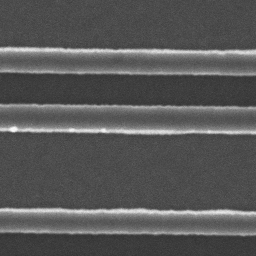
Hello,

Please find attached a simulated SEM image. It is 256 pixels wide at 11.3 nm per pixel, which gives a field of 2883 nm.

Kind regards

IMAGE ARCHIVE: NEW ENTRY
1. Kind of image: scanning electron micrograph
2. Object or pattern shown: lines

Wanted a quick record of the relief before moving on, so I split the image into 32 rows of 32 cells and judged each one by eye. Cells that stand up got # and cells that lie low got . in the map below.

................................
................................
................................
................................
................................
................................
####################............
################################
################################
................................
................................
................................
................................
##############################..
################################
################################
.....................###.#######
................................
................................
................................
................................
................................
................................
................................
................................
................................
#########.#.##.#.#..............
################################
################################
................................
................................
................................